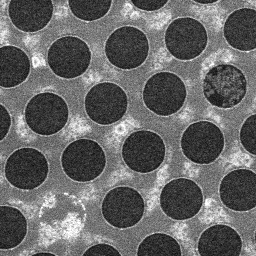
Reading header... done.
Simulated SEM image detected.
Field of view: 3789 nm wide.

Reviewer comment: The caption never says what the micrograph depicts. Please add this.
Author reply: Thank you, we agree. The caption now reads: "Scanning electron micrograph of a regular array of raised bodies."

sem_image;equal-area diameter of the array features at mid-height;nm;656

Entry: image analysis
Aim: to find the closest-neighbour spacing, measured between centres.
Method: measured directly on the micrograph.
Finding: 872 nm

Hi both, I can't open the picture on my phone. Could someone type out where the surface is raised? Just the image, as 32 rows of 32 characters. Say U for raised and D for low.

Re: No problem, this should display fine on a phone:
DUUUUUUDDUUUUUDDUUUUUDDDDUDDDDDD
DUUUUUUDDUUUUDDDDDDDDDDDDDDDDUUU
DUUUUUDDDDUUDDDDDDDDDDUUUDDDUUUU
DDUUUDDDDDDDDDDUUDDDDUUUUUDDUUUU
DDDDDDDDDDDDDDUUUUDDDUUUUUDDUUUU
DDDDDDUUUUUDDUUUUUUDDUUUUUDDDUUU
UUUDDDUUUUUDDUUUUUUDDUUUUDDDDDDD
UUUUUDUUUUUDDDUUUUDDDDUUDDDDDDDD
UUUUDDUUUUUDDDDUUDDDDDDDDDDDDDDD
UUUUDDDUUUDDDDDDDDDUUUDDDDDDDDDD
UUUDDDDDDDDDUUDDDDUUUUUDDDDDDDDD
DDDDDDDDDDDUUUUUDDUUUUUDDDDDDDDD
DDDDUUUUDDDUUUUUDDUUUUUDDDDDDDDD
UDDUUUUUUDDUUUUUDDUUUUUDDDDDDDDD
UDDUUUUUUDDUUUUDDDDDUDDDDDDDDDDU
UDDUUUUUDDDDUUDDDDDDDDDDUUUDDDUU
UDDDUUUDDDDDDDDDDUUDDDDUUUUUDDUU
DDDDDDDDDDUDDDDDUUUUDDDUUUUUDDUU
DDDUDDDDUUUUUDDUUUUUUDDUUUUUDDUU
DUUUUUDDUUUUUDDUUUUUUDDUUUUDDDDD
DUUUUUDDUUUUUDDDUUUUDDDDDUDDDDDD
DUUUUUDDUUUUUDDDDUUDDDDDDDDDDUUU
DUUUUUDDDUUUDDDDDDDDDDUUDDDDUUUU
DDUUDDDDDDDDDDUUUDDDUUUUUDDUUUUU
DDDDDDDDDDDDDUUUUUDDUUUUUDDUUUUU
DDDDDDDDDDDDDUUUUUDDUUUUUDDDUUUU
UUUDDDDDDDDDDUUUUUDDUUUUUDDDDDDD
UUUDDDDDDDDDDUUUUUDDDDUDDDDDDDDD
UUUDDDDDDDDDDDDUDDDDDDDDDDUUUDDD
UUUDDDDDDDDDDDDDDDUUUDDDDUUUUUDD
UUDDDDDDDDDDUDDDDUUUUUDDDUUUUUDD
DDDDDDDDDDDUUUUDDUUUUUUDDUUUUUDD